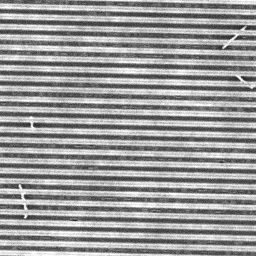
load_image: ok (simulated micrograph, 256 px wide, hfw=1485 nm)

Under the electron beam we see parallel lines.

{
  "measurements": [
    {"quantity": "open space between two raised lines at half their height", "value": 5.74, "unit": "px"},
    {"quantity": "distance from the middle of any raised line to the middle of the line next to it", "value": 59.6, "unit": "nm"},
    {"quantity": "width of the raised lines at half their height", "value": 27.5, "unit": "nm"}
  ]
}